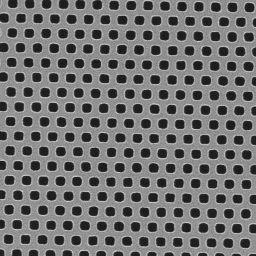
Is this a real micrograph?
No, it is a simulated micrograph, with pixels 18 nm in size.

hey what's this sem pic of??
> a regular array of holes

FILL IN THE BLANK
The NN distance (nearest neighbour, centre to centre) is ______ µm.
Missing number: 0.3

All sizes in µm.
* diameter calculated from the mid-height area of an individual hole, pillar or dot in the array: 0.192